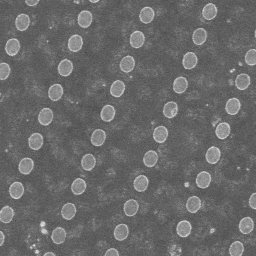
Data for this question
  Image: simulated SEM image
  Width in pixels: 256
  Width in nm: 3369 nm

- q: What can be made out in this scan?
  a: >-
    a regular array of raised bodies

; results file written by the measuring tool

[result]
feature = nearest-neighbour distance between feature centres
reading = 345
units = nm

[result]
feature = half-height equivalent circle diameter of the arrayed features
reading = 15.2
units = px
